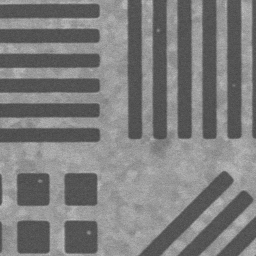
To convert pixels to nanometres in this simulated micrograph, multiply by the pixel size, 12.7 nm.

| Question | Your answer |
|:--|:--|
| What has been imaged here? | groups of lines, slits or small figures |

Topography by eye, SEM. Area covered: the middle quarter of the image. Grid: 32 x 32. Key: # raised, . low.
.........#######....##....##....
################....##....##....
################....##....##....
........########....##....##....
.........#######....##....##....
.........#######....##....##....
.........#######....##....##....
################....##....##....
################....##....##....
################....##....##....
.........#######....##....##....
.........#######....##....##....
.........#######....##....##....
........########....##....##....
################....##....##....
################....##....##....
.........#######....##....##....
.........#######....##....##....
.........#######...###....##....
........########################
################################
################################
################################
################################
################################
################################
################################
........########################
.........#######################
.........#######################
.........#######################
.........#######################